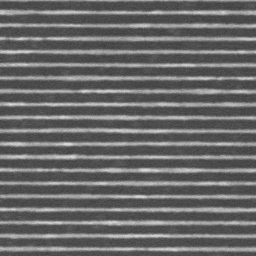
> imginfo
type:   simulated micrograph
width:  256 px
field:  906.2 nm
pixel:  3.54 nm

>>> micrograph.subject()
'parallel lines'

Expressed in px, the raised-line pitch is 13.1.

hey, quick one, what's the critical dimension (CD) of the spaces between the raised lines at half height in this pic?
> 36.7 nm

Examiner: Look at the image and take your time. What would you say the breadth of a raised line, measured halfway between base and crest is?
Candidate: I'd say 9.7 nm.